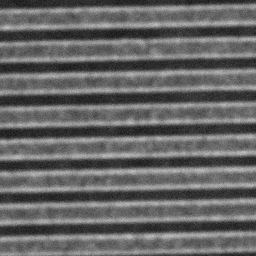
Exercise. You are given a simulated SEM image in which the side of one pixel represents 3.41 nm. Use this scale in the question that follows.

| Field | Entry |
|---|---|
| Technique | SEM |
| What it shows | parallel lines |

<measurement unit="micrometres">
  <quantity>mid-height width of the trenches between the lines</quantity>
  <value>0.0516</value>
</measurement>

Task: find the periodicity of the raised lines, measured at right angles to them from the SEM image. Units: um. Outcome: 0.111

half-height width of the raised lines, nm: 60.5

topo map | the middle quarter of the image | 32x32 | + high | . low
................................
................................
..................++++++++++++++
++++++++++++++++++++++++++++++++
++++++++++++++++++++++++++++++++
++++++++++++++++++++++++++++++++
++++++++++++++++++..............
................................
................................
................................
...................+++++++++++++
++++++++++++++++++++++++++++++++
++++++++++++++++++++++++++++++++
++++++++++++++++++++++++++++++++
+++++++++++++++++++++++++++++...
................................
................................
................................
.............................+++
++++++++++++++++++++++++++++++++
++++++++++++++++++++++++++++++++
++++++++++++++++++++++++++++++++
+++++++++++++++++++++++++++++...
................................
................................
................................
.............................+++
++++++++++++++++++++++++++++++++
++++++++++++++++++++++++++++++++
++++++++++++++++++++++++++++++++
++++++++++++++++++++++++++++++++
................................